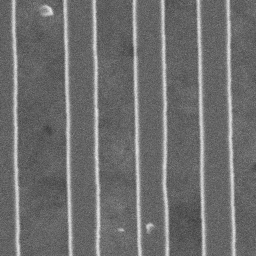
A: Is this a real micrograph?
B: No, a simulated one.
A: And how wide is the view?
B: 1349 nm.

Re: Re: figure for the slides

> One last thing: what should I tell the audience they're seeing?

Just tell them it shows lines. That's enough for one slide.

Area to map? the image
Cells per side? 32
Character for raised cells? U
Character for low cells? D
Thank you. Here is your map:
UUDDDDDDUUUUDDDDDUUUDDDDDUUUUDDD
UUDDDDDDUUUUDDDDDUUUDDDDDUUUUDDD
UUDDDDDDUUUUDDDDDUUUDDDDDUUUUDDD
UUDDDDDDUUUUDDDDDUUUDDDDDUUUUDDD
UUDDDDDDUUUUDDDDDUUUUDDDDUUUUDDD
UUDDDDDDUUUUDDDDDUUUUDDDDUUUUDDD
UUDDDDDDUUUUDDDDDUUUUDDDDUUUUDDD
UUDDDDDDUUUUDDDDDUUUUDDDDUUUUDDD
UUDDDDDDUUUUDDDDDUUUUDDDDUUUUDDD
UUDDDDDDUUUUDDDDDUUUUDDDDUUUUDDD
UUDDDDDDUUUUDDDDDUUUUDDDDUUUUDDD
UUDDDDDDUUUUDDDDDUUUUDDDDUUUUDDD
UUDDDDDDUUUUDDDDDUUUUDDDDUUUUDDD
UUDDDDDDUUUUDDDDDUUUUDDDDUUUUDDD
UUDDDDDDUUUUDDDDDUUUUDDDDUUUUDDD
UUDDDDDDUUUUDDDDDUUUUDDDDUUUUDDD
UUDDDDDDUUUUDDDDDUUUUDDDDUUUUDDD
UUDDDDDDUUUUDDDDDUUUUDDDDUUUUDDD
UUDDDDDDUUUUDDDDDUUUUDDDDUUUUDDD
UUDDDDDDUUUUDDDDDUUUUDDDDUUUUDDD
UUDDDDDDUUUUDDDDDUUUUDDDDUUUUDDD
UUDDDDDDUUUUDDDDDUUUUDDDDUUUUDDD
UUDDDDDDUUUUDDDDDUUUUDDDDUUUUDDD
UUDDDDDDDUUUDDDDDUUUUDDDDUUUUDDD
UUDDDDDDDUUUDDDDDUUUUDDDDUUUUDDD
UUDDDDDDDUUUDDDDDUUUUDDDDUUUUDDD
UUDDDDDDDUUUDDDDDUUUUDDDDUUUUDDD
UUDDDDDDDUUUDDDDDUUUUDDDDUUUUDDD
UUDDDDDDDUUUDDDDDUUUUDDDDUUUUDDD
UUDDDDDDDUUUDDDDDUUUUDDDDUUUUDDD
UUDDDDDDDUUUDDDDDUUUUDDDDUUUUDDD
UUDDDDDDDUUUDDDDDUUUUDDDDUUUUDDD